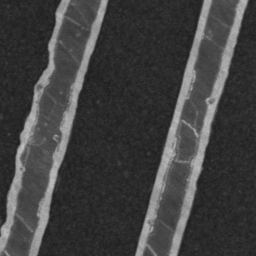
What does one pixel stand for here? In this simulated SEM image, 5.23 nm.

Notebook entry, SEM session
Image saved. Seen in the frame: one or a few lines or trenches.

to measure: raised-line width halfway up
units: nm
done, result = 179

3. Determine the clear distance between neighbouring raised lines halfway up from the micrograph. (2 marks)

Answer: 534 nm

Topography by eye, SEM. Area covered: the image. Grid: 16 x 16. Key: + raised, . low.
....++.......++.
....++.......++.
...+++......+++.
...++.......++..
...++.......++..
..+++.......++..
..+++......++...
..++.......++...
..++.......++...
.+++......+++...
.+++......++....
.++.......++....
.++.......++....
.++......+++....
+++......++.....
++.......++.....